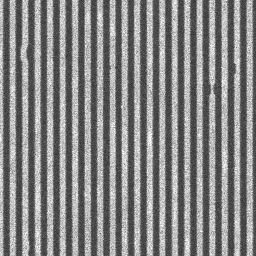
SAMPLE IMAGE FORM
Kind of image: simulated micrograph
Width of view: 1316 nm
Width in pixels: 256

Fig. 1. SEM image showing parallel lines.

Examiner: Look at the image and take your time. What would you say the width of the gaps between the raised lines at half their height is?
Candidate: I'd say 0.0347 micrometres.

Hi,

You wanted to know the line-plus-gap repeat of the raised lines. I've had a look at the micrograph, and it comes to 64.1 nanometres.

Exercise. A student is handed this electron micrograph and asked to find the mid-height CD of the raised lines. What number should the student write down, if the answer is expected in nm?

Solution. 30.8